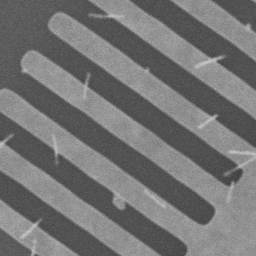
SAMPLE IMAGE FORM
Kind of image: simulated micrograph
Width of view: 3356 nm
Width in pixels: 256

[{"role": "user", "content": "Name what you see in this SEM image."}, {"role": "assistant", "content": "groups of lines, slits or small figures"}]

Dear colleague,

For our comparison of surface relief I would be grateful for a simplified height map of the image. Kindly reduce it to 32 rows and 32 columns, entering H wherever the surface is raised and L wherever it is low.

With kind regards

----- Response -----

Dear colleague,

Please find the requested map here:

LLLLLLLLLLLLHHHHHLLLLLHHHHHLLLLL
LLLLLLLLLLLLLHHHHHLLLLLHHHHHLLLL
LLLLLLHHHLLLLLLHHHHHLLLLLHHHHHLL
LLLLLLHHHHHLLLLLHHHHHLLLLLHHHHHL
LLLLLLLHHHHHLLLLLHHHHHLLLLLLHHHH
LLLLLLLLLHHHHHLLLLLHHHHHLLLLLHHH
LLLLHLLLLLHHHHHLLLLLHHHHHLLLLLLH
LLLHHHLLLLLHHHHHLLLLLLHHHHHLLLLL
LLLHHHHHLLLLLHHHHHLLLLLHHHHHLLLL
LLLLHHHHHLLLLLHHHHHLLLLLHHHHHLLL
LLLLLHHHHHHLLLLLHHHHHLLLLLHHHHHL
HHLLLLLHHHHHLLLLLHHHHHLLLLLHHHHH
HHHLLLLLHHHHHLLLLLLHHHHLLLLLLHHH
HHHHLLLLLLHHHHHLLLLLHHHHHLLLLLHH
LHHHHHLLLLLHHHHHLLLLLHHHHHLLLLLH
LLHHHHHLLLLLLHHHHLLLLLLHHHHHLLLL
LLLLHHHHLLLLLLHHHHHLLLLLHHHHHLLL
LLLLLHHHHHLLLLLHHHHHLLLLLHHHHHLL
HLLLLLHHHHHLLLLLLHHHHLLLLLLHHHHH
HHHLLLLLHHHHHLLLLLHHHHHLLLLLHHHH
HHHHLLLLLHHHHHLLLLLLHHHHLLLLLLHH
HHHHHLLLLLLHHHHHLLLLLHHHHHLLLLHH
LLHHHHHLLLLLHHHHHLLLLLHHHHHLLLHH
LLLHHHHHLLLLLHHHHHLLLLLLHHHHHHHH
LLLLLHHHHLLLLLLHHHHHLLLLLHHHHHHH
HLLLLLHHHHHLLLLLHHHHHLLLLLHHHHHH
HHLLLLLHHHHHLLLLLHHHHHHLLLLHHHHH
HHHHLLLLLHHHHHLLLLLHHHHHLLHHHHHH
HHHHHLLLLLHHHHHLLLLLHHHHHHHHHHHH
LHHHHHLLLLLLHHHHHLLLLLHHHHHHHHHH
LLLHHHHHLLLLLHHHHHLLLLLHHHHHHHHH
LLLLHHHHHLLLLLLHHHHLLLLHHHHHHHHH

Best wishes